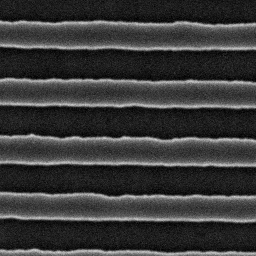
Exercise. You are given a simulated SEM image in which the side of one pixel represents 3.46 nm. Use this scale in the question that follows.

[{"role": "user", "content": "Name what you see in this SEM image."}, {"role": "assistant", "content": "lines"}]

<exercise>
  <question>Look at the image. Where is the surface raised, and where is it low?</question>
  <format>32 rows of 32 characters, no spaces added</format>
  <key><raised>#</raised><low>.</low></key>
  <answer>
................................
................................
................................
################################
################################
################################
................................
................................
................................
................................
################################
################################
################################
................................
................................
................................
................................
################################
################################
################################
...####...######################
................................
................................
................................
#############..##.###...##......
################################
################################
.......................###.#####
................................
................................
................................
###################.............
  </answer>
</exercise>